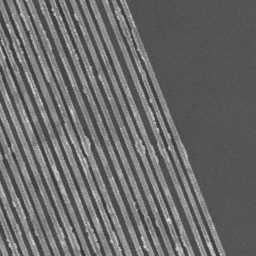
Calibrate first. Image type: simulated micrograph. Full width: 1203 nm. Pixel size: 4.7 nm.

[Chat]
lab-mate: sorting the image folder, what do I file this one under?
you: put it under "parallel lines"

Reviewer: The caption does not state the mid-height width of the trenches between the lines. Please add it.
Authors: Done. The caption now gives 19.1 nanometres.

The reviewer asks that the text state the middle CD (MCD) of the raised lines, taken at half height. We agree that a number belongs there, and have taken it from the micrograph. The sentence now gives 23.5 nm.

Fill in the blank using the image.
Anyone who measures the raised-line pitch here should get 45.1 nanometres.